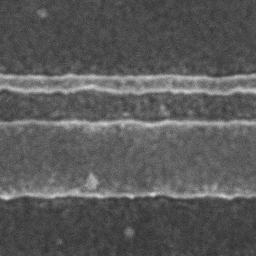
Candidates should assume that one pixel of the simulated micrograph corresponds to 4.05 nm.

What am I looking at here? lines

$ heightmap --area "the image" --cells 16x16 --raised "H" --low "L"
LLLLLLLLLLLLLLLL
LLLLLLLLLLLLLLLL
LLLLLLLLLLLLLLLL
LLLLLLLLLLLLLLLL
LLLLLLLLLLLLLLLL
HHHHHHHHHHHHHHHH
HHHHHHHHHHHHHHHH
HHHHHHHHHHHHHHHH
HHHHHHHHHHHHHHHH
HHHHHHHHHHHHHHHH
HHHHHHHHHHHHHHHH
HHHHHHHHHHHHHHHH
LLLLLLLLLLLLLLLL
LLLLLLLLLLLLLLLL
LLLLLLLLLLLLLLLL
LLLLLLLLLLLLLLLL